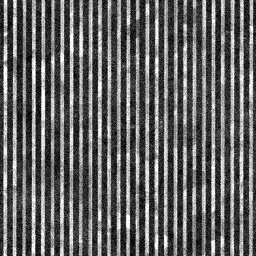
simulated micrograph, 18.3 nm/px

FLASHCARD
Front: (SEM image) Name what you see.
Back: parallel lines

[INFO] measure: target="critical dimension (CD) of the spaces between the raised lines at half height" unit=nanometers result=124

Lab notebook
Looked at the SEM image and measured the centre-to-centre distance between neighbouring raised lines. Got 173 nm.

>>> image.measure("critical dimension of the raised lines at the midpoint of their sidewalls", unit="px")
3